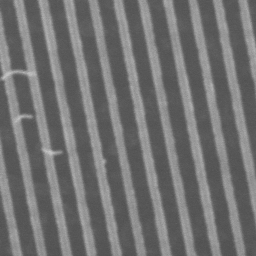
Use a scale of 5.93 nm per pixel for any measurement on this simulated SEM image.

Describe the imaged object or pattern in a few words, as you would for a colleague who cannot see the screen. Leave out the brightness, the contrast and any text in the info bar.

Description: parallel lines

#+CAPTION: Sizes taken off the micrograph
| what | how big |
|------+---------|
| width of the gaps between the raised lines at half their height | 103 nm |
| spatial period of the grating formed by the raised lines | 145 nm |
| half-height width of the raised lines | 43.7 nanometres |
